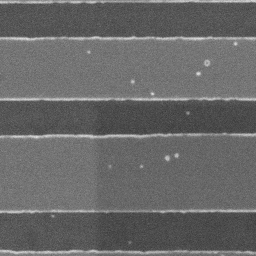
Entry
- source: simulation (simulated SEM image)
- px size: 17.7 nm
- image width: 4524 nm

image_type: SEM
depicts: lines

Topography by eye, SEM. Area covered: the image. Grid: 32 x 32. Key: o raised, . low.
................................
................................
................................
................................
................................
oooooooooooooooooooooooooooooooo
oooooooooooooooooooooooooooooooo
oooooooooooooooooooooooooooooooo
oooooooooooooooooooooooooooooooo
oooooooooooooooooooooooooooooooo
oooooooooooooooooooooooooooooooo
oooooooooooooooooooooooooooooooo
................................
................................
................................
................................
................................
oooooooooooooooooooooooooooooooo
oooooooooooooooooooooooooooooooo
oooooooooooooooooooooooooooooooo
oooooooooooooooooooooooooooooooo
oooooooooooooooooooooooooooooooo
oooooooooooooooooooooooooooooooo
oooooooooooooooooooooooooooooooo
oooooooooooooooooooooooooooooooo
oooooooooooooooooooooooooooooooo
ooo.o........o........o.........
................................
................................
................................
................................
oooooooooooooooooooooooooooooooo